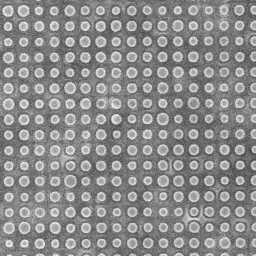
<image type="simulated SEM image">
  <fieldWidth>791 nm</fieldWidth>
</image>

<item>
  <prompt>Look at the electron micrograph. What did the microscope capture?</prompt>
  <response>a regular array of raised bodies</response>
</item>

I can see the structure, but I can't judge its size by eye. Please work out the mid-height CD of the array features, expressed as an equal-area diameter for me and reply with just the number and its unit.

27.7 nanometers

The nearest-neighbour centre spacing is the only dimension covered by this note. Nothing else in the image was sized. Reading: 15.1 pixels